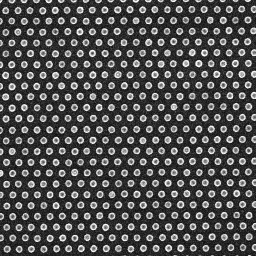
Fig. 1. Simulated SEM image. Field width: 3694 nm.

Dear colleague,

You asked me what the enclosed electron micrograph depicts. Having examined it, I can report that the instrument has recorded a regular array of raised bodies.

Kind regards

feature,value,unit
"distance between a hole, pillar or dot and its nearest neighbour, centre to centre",0.173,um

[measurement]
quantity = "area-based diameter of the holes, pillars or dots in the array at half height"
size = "87.7 nanometres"